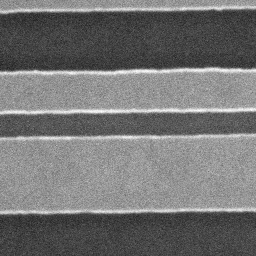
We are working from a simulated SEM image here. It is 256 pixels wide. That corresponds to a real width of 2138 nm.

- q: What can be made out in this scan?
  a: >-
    lines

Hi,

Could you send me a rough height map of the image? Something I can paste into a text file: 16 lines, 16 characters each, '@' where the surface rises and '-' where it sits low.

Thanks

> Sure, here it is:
@@@@@@@@@@@@@@--
----------------
----------------
----------------
-@@@-@-@@@@@@@@@
@@@@@@@@@@@@@@@@
@@@@@@@@@@@@@@@@
@@@@@@@@@@@@@@@@
@@@@@@@@@@@@@@@@
@@@@@@@@@@@@@@@@
@@@@@@@@@@@@@@@@
@@@@@@@@@@@@@@@@
@@@@@@@@@@@@@@@@
----------------
----------------
----------------